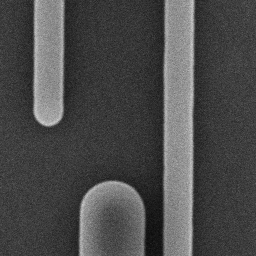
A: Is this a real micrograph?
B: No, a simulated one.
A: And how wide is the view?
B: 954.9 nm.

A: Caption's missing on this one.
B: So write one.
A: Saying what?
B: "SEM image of groups of lines, slits or small figures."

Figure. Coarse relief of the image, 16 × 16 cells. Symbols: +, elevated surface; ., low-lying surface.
..++......++....
..++......++....
..++......++....
..++......++....
..++......++....
..++......++....
..++......++....
..++......++....
..........++....
..........++....
..........++....
......++..++....
.....++++.++....
.....++++.++....
.....++++.++....
.....++++.++....